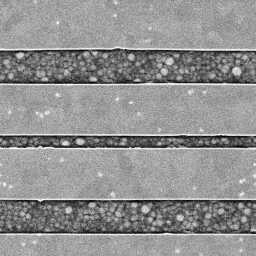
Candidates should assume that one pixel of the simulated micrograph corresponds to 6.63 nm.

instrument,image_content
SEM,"one or a few lines or trenches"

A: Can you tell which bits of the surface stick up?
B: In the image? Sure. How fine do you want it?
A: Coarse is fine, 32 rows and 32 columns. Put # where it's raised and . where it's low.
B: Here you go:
################################
################################
################################
################################
################################
################################
................................
................................
................................
................................
...........#....................
################################
################################
################################
################################
################################
################################
................................
....#####.......................
################################
################################
################################
################################
################################
################################
................................
................................
................................
................................
################################
################################
################################